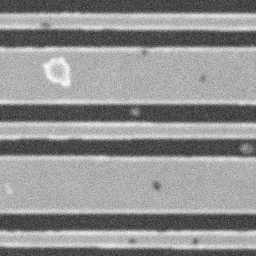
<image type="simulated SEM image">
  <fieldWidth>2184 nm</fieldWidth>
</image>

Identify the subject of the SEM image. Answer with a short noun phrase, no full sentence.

lines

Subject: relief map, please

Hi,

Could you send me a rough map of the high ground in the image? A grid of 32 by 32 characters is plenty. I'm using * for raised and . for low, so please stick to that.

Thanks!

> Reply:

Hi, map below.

................................
................................
********************************
********************************
................................
................................
********************************
********************************
********************************
********************************
********************************
********************************
********************************
................................
................................
*******************.............
********************************
................................
................................
................................
********************************
********************************
********************************
********************************
********************************
********************************
********************************
................................
................................
********************************
********************************
................................